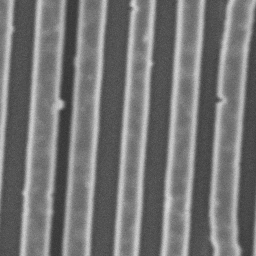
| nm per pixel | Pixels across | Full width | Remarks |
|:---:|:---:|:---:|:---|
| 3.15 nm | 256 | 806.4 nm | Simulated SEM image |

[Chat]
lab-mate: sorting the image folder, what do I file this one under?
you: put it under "parallel lines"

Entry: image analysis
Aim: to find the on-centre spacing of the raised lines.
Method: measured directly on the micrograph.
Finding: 147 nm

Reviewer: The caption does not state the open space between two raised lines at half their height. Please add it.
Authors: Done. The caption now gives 81 nanometers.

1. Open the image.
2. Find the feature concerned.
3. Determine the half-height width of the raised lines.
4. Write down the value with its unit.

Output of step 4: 75.1 nanometres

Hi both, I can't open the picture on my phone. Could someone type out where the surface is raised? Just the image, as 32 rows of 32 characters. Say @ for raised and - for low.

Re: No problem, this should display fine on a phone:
@----@@@--@@@----@@---@@@----@@@
@----@@@--@@@----@@---@@@----@@@
@----@@@--@@@----@@---@@@---@@@-
@----@@@--@@@---@@@---@@@---@@@-
@----@@@--@@@---@@@---@@@---@@@-
@---@@@@--@@@---@@@---@@@---@@@-
@---@@@@--@@@---@@@---@@@---@@@-
@---@@@@--@@@---@@@---@@@---@@@-
@---@@@@--@@@---@@@---@@@---@@@-
@---@@@---@@----@@@---@@@---@@@-
@---@@@--@@@----@@----@@@--@@@--
@---@@@--@@@----@@----@@@--@@@--
@---@@@@-@@@----@@----@@@---@@--
@---@@@@-@@@----@@----@@---@@@--
----@@@--@@@----@@----@@---@@@--
----@@@--@@@----@@----@@---@@@--
----@@@--@@@---@@@---@@@---@@@--
----@@@--@@@---@@@---@@@---@@@--
----@@@--@@@---@@@---@@@---@@@--
----@@@--@@@---@@@---@@@---@@@--
---@@@@--@@@---@@@---@@@---@@@--
----@@@--@@@---@@@---@@@---@@@--
---@@@@--@@@---@@@---@@@---@@@--
---@@@@--@@----@@@---@@@---@@@--
---@@@--@@@----@@@---@@@---@@---
---@@@--@@@----@@@---@@@--@@@---
---@@@--@@@----@@----@@@--@@@---
---@@@--@@@----@@----@@@--@@@---
---@@@--@@@----@@----@@----@@@--
---@@@--@@@----@@----@@----@@---
---@@@--@@@----@@----@@----@@@--
---@@@--@@@---@@@---@@@----@@@--